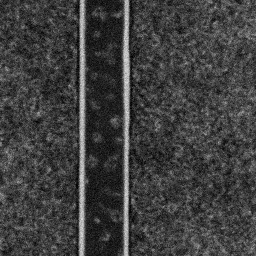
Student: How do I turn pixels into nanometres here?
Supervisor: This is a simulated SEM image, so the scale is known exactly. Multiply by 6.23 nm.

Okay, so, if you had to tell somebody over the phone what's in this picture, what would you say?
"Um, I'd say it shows one or a few lines or trenches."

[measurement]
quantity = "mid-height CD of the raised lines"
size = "286 nanometres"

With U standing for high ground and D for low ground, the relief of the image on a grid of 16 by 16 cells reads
DDDDDUUUDDDDDDDD
DDDDDUUUDDDDDDDD
DDDDDUUUDDDDDDDD
DDDDDUUUDDDDDDDD
DDDDDUUUDDDDDDDD
DDDDDUUUDDDDDDDD
DDDDDUUUDDDDDDDD
DDDDDUUUDDDDDDDD
DDDDDUUUDDDDDDDD
DDDDDUUUDDDDDDDD
DDDDDUUUDDDDDDDD
DDDDDUUUDDDDDDDD
DDDDDUUUDDDDDDDD
DDDDDUUUDDDDDDDD
DDDDDUUUDDDDDDDD
DDDDDUUUDDDDDDDD